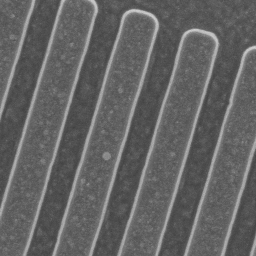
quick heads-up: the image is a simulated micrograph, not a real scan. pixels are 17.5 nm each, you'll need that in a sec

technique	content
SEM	parallel lines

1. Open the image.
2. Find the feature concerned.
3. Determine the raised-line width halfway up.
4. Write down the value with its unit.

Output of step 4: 0.63 micrometres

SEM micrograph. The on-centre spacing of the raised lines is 1100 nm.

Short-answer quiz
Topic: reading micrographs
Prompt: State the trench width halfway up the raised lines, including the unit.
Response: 27.2 pixels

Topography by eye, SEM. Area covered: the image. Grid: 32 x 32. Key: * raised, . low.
****....****....................
****...*****....**..............
***....*****...****.............
***....****....*****............
***...*****....****....****.....
***...*****...*****....****.....
**....*****...*****...*****....*
**....****....*****...*****...**
**...*****....****....****....**
*....*****...*****....****....**
*....****....*****...*****...***
*...*****....****....*****...***
*...*****...*****....****....***
....*****...*****...*****....***
....****....****....*****...****
...*****...*****....****....****
...*****...*****...*****....****
...****....*****...*****...*****
..*****....****....*****...*****
..*****...*****....****....****.
..*****...*****...*****....****.
.*****....****....*****...*****.
.*****...*****....****....*****.
.*****...*****...*****....****..
.****....*****...*****...*****..
*****....****....****....*****..
*****...*****....****....****...
*****...*****...*****...*****...
****....****....*****...*****...
****...*****....****....*****...
****...*****...*****....****....
***....****....*****...*****....